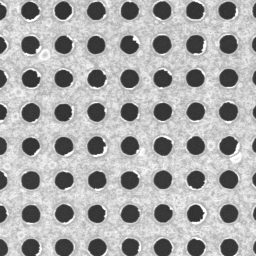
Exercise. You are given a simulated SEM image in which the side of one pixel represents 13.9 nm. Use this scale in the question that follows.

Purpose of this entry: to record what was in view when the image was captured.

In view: a regular array of holes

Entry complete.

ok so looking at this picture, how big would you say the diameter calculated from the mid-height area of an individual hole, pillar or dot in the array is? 260 nm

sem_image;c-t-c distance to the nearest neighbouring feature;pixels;32.8